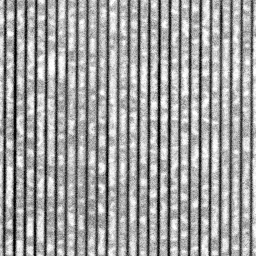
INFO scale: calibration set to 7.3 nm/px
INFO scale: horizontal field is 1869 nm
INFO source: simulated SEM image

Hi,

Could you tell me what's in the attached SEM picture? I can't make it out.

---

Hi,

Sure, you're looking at parallel lines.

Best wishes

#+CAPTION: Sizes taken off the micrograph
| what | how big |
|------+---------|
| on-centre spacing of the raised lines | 74.9 nm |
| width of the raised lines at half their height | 56.6 nanometers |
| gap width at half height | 19.2 nm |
